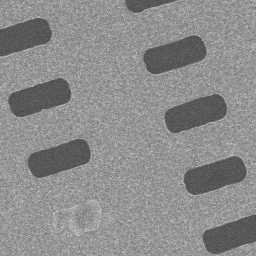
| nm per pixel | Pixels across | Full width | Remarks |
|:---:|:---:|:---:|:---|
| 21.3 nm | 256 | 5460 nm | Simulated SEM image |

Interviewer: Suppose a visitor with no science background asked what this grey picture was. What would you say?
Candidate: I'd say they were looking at holes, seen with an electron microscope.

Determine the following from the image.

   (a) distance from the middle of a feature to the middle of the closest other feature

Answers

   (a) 1.36 microns